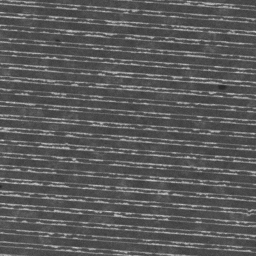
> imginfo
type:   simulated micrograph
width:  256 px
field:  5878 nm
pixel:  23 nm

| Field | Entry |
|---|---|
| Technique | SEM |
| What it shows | parallel lines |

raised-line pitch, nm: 292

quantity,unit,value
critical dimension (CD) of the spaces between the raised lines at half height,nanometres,180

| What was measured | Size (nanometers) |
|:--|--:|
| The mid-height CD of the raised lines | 109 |